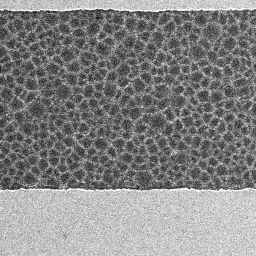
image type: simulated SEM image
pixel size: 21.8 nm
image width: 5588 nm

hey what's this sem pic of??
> one or a few lines or trenches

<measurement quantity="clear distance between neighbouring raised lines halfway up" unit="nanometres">3920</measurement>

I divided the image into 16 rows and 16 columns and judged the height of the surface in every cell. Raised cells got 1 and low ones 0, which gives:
1111111111111111
0000000000000000
0000000000000000
0000000000000000
0000000000000000
0000000000000000
0000000000000000
0000000000000000
0000000000000000
0000000000000000
0000000000000000
0000000000000000
1111111111111111
1111111111111111
1111111111111111
1111111111111111